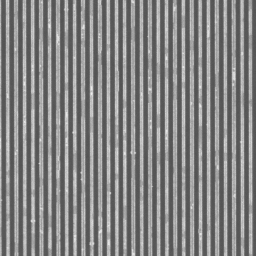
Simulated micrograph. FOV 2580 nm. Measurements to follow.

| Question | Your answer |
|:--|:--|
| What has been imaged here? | parallel lines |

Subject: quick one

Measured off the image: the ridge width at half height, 0.0365 µm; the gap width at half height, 45.4 nanometers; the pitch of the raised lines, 84.4 nanometres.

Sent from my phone